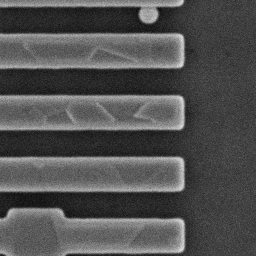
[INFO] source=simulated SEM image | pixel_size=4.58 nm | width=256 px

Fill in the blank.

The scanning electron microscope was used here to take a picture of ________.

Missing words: wiring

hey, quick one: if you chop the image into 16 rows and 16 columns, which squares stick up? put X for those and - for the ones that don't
---------X------
----------------
XXXXXXXXXXX-----
XXXXXXXXXXX-----
----------------
----------------
XXXXXXXXXXX-----
XXXXXXXXXXX-----
----------------
----------------
XXXXXXXXXXX-----
XXXXXXXXXXX-----
----------------
XXXX------------
XXXXXXXXXXX-----
XXXXXXXXXXX-----